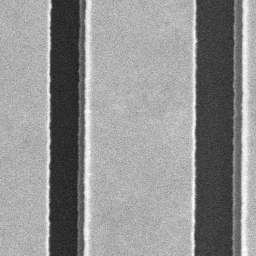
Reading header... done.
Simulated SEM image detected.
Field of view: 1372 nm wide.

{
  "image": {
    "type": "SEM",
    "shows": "lines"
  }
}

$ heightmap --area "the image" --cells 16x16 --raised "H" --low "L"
HHHLLHHHHHHHLLLH
HHHLLHHHHHHHLLLH
HHHLLHHHHHHHLLLH
HHHLLHHHHHHHLLLH
HHHLLHHHHHHHLLLH
HHHLLHHHHHHHLLLH
HHHLLHHHHHHHLLLH
HHHLLHHHHHHHLLLH
HHHLLHHHHHHHLLLH
HHHLLHHHHHHHLLLH
HHHLLHHHHHHHLLLH
HHHLLHHHHHHHLLLH
HHHLLHHHHHHHLLLH
HHHLLHHHHHHHLLLH
HHHLLHHHHHHHLLLH
HHHLLHHHHHHHLLLH